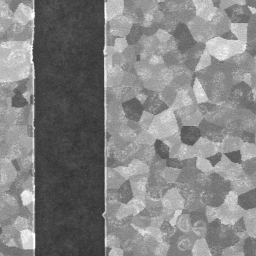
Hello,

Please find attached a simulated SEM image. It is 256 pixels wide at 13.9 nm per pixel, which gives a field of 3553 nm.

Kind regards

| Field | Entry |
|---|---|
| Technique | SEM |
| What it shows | one or a few lines or trenches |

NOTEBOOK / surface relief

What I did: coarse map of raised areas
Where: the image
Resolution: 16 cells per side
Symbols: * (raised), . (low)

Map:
**.....*********
**.....*********
**.....*********
**.....*********
**.....*********
**.....*********
**.....*********
**.....*********
**.....*********
**.....*********
**.....*********
**.....*********
**.....*********
**.....*********
**.....*********
**.....*********